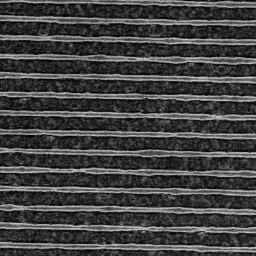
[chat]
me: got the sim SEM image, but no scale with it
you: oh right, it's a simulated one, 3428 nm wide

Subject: parallel lines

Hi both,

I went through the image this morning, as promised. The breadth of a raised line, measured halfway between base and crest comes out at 48.5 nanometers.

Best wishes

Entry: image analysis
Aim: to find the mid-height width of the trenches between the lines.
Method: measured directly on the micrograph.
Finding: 0.199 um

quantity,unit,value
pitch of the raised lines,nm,252